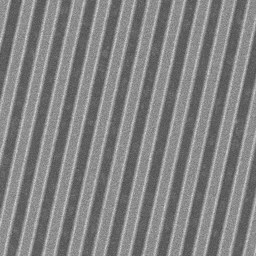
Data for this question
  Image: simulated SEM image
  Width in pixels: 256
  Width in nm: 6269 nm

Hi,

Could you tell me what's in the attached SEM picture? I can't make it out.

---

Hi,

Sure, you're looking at parallel lines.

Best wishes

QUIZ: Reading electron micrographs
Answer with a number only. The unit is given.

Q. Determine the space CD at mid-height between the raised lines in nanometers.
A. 296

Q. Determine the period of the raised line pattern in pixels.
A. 24.5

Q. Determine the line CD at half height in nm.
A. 296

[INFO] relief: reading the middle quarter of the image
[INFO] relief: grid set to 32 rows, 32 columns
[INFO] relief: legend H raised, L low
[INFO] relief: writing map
HHLLLHHHLLLHHHLLLHHHLLLLHHHLLLHH
HLLLLHHHLLLHHHLLLHHHLLLLHHHLLLHH
HLLLLHHHLLLHHHLLLHHHLLLHHHLLLLHH
HLLLHHHLLLLHHHLLLHHHLLLHHHLLLHHH
HLLLHHHLLLHHHLLLLHHHLLLHHHLLLHHH
HLLLHHHLLLHHHLLLHHHLLLLHHHLLLHHH
LLLLHHHLLLHHHLLLHHHLLLHHHHLLLHHH
LLLHHHHLLLHHHLLLHHHLLLHHHLLLHHHH
LLLHHHLLLLHHHLLLHHHLLLHHHLLLHHHL
LLLHHHLLLHHHLLLLHHHLLLHHHLLLHHHL
LLLHHHLLLHHHLLLHHHLLLLHHHLLLHHHL
LLHHHHLLLHHHLLLHHHLLLHHHLLLLHHHL
LLHHHLLLLHHHLLLHHHLLLHHHLLLHHHLL
LLHHHLLLHHHLLLLHHHLLLHHHLLLHHHLL
LLHHHLLLHHHLLLHHHLLLLHHHLLLHHHLL
LLHHHLLLHHHLLLHHHLLLHHHLLLLHHHLL
LHHHHLLLHHHLLLHHHLLLHHHLLLLHHHLL
LHHHLLLLHHHLLLHHHLLLHHHLLLHHHLLL
LHHHLLLHHHLLLLHHHLLLHHHLLLHHHLLL
LHHHLLLHHHLLLHHHLLLLHHHLLLHHHLLL
LHHHLLLHHHLLLHHHLLLHHHHLLLHHHLLL
HHHHLLLHHHLLLHHHLLLHHHLLLLHHHLLL
HHHLLLLHHHLLLHHHLLLHHHLLLHHHLLLL
HHHLLLHHHLLLHHHLLLLHHHLLLHHHLLLH
HHHLLLHHHLLLHHHLLLHHHHLLLHHHLLLH
HHHLLLHHHLLLHHHLLLHHHLLLLHHHLLLH
HHLLLLHHHLLLHHHLLLHHHLLLHHHLLLLH
HHLLLHHHLLLLHHHLLLHHHLLLHHHLLLHH
HHLLLHHHLLLHHHLLLLHHHLLLHHHLLLHH
HHLLLHHHLLLHHHLLLHHHHLLLHHHLLLHH
HHLLLHHHLLLHHHLLLHHHLLLLHHHLLLHH
HLLLLHHHLLLHHHLLLHHHLLLHHHLLLLHH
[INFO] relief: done